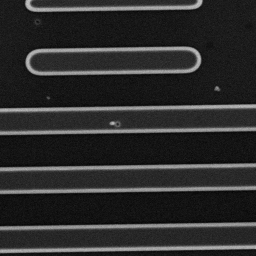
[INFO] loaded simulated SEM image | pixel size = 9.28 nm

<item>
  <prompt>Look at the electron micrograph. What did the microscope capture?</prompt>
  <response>groups of lines, slits or small figures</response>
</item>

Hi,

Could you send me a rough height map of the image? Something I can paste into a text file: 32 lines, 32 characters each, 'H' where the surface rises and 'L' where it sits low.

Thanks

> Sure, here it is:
LLLHHHHHHHHHHHHHHHHHHHHHHLLLLLLL
LLLLLLLLLLLLLLLLLLLLLLLLLLLLLLLL
LLLLLLLLLLLLLLLLLLLLLLLLLLLLLLLL
LLLLLLLLLLLLLLLLLLLLLLLLLLLLLLLL
LLLLLLLLLLLLLLLLLLLLLLLLLLLLLLLL
LLLLLLLLLLLLLLLLLLLLLLLLLLLLLLLL
LLLLHHHHHHHHHHHHHHHHHHHHLLLLLLLL
LLLHHHHHHHHHHHHHHHHHHHHHHLLLLLLL
LLLLHHHHHHHHHHHHHHHHHHHHLLLLLLLL
LLLLLLLLLLLLLLLLLLLLLLLLLLLLLLLL
LLLLLLLLLLLLLLLLLLLLLLLLLLLLLLLL
LLLLLLLLLLLLLLLLLLLLLLLLLLLLLLLL
LLLLLLLLLLLLLLLLLLLLLLLLLLLLLLLL
LLLLLLLLLLLLLLLLLLLLHHHHHHHHHHHH
HHHHHHHHHHHHHHHHHHHHHHHHHHHHHHHH
HHHHHHHHHHHHHHHHHHHHHHHHHHHHHHHH
HHHHHHHHHHHLLLLLLLLLLLLLLLLLLLLL
LLLLLLLLLLLLLLLLLLLLLLLLLLLLLLLL
LLLLLLLLLLLLLLLLLLLLLLLLLLLLLLLL
LLLLLLLLLLLLLLLLLLLLLLLLLLLLLLLL
LLLLLLLLLLLLLLLLLLLLLLLLLLLLLLLL
HHHHHHHHHHHHHHHHHHHHHHHHHHHHHHHH
HHHHHHHHHHHHHHHHHHHHHHHHHHHHHHHH
HHHHHHHHHHHHHHHHHHHHHHHHHHHHHHHH
LLLLLLLLLLLLLLLLLLLLLLLLLLLLLLLL
LLLLLLLLLLLLLLLLLLLLLLLLLLLLLLLL
LLLLLLLLLLLLLLLLLLLLLLLLLLLLLLLL
LLLLLLLLLLLLLLLLLLLLLLLLLLLLLLLL
LLHHHHHHHHHHHHHHHHHHHHHHHHHHHHHH
HHHHHHHHHHHHHHHHHHHHHHHHHHHHHHHH
HHHHHHHHHHHHHHHHHHHHHHHHHHHHHHHH
LLLLLLLLLLLLLLLLLLLLLLLLLLLLLLLL